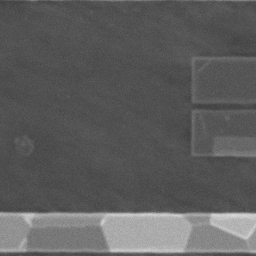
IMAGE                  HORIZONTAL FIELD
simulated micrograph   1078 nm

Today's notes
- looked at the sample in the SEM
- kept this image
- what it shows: wiring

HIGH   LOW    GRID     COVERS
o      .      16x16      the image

................
................
................
................
............oooo
............oooo
................
............oooo
............oooo
............oooo
................
................
................
o......ooooooooo
oooooooooooooooo
oooooooooooooooo